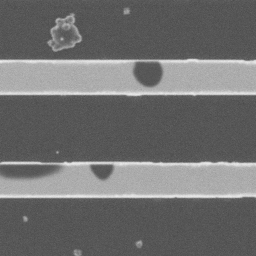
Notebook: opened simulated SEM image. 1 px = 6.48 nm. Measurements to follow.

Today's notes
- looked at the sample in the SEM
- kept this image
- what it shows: lines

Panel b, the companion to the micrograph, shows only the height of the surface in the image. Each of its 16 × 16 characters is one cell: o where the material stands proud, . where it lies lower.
................
................
................
................
oooooooooooooooo
oooooooooooooooo
................
................
................
................
oooooooooooooooo
oooooooooooooooo
................
................
................
................